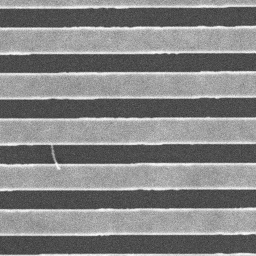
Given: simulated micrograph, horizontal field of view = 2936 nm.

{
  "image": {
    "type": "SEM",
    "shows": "lines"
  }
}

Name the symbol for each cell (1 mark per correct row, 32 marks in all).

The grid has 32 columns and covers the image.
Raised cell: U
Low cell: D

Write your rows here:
UUUUUUUUUUUUUUUUUUUUUUUUUUUUUUUU
DDDDDDDDDDDDDDDDDDDDDDDDDDDDDDDD
DDDDDDDDDDDDDDDDDDDDDDDDDDDDDDDD
DDDDDDDDUUUUUUUUUUUUUUUUUUUUUUUU
UUUUUUUUUUUUUUUUUUUUUUUUUUUUUUUU
UUUUUUUUUUUUUUUUUUUUUUUUUUUUUUUU
UUUUUUUUUUUUUUUUUUUUUUUUUUUUUUUU
DDDDDDDDDDDDDDDDDDDDDDDDDDDDDDDD
DDDDDDDDDDDDDDDDDDDDDDDDDDDDDDDD
UUUUUUUUUUUUUUUUUUUUUUUUUUUUUUUU
UUUUUUUUUUUUUUUUUUUUUUUUUUUUUUUU
UUUUUUUUUUUUUUUUUUUUUUUUUUUUUUUU
DDDDDDDDDDDDDDDDDDDDDDDDDDDDDDDD
DDDDDDDDDDDDDDDDDDDDDDDDDDDDDDDD
DDDDDDDDDDDDDDDDDDDDDDDDDDDDDDDD
UUUUUUUUUUUUUUUUUUUUUUUUUUUUUUUU
UUUUUUUUUUUUUUUUUUUUUUUUUUUUUUUU
UUUUUUUUUUUUUUUUUUUUUUUUUUUUUUUU
DDDDDDDDDDDDDDDDDDDDDDDDDDDDDDDD
DDDDDDDDDDDDDDDDDDDDDDDDDDDDDDDD
DDDDDDUUDDDDDDDDDUUUUUUUUUUUUUUU
UUUUUUUUUUUUUUUUUUUUUUUUUUUUUUUU
UUUUUUUUUUUUUUUUUUUUUUUUUUUUUUUU
UUUUUUUUUUUUUUUUUUUUUUUUUUUUUUUU
DDDDDDDDDDDDDDDDDDDDDDDDDDDDDDDD
DDDDDDDDDDDDDDDDDDDDDDDDDDDDDDDD
UUUUUUUUUUUUUUUUUUUUUUUUUUUUUUUU
UUUUUUUUUUUUUUUUUUUUUUUUUUUUUUUU
UUUUUUUUUUUUUUUUUUUUUUUUUUUUUUUU
DDDDDDDDDDDDDDDDDDDDDDDDDDDDDDDD
DDDDDDDDDDDDDDDDDDDDDDDDDDDDDDDD
DDDDDDDDDDDDDDDDDDDDDDDDDDDDDDDD